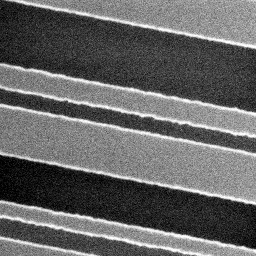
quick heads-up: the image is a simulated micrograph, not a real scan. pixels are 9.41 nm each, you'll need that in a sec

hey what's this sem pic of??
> lines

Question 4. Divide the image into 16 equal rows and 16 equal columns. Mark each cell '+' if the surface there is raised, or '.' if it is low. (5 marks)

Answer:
...+++++++++++++
........++++++++
.............+++
................
+++.............
++++++++........
+++++++++++++...
++++++++++++++++
++++++++++++++++
++++++++++++++++
....++++++++++++
..........++++++
...............+
+++++...........
++++++++++......
+++++++++++++++.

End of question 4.